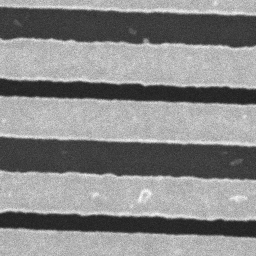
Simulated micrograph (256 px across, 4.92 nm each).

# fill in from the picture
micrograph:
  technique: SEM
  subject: lines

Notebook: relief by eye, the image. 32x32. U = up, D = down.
UUUUUUUUUUUUUUUUUUUUUUUUUUUUUUUU
DDDDDDDDDDDDDDDDDDUDUUUUUUUUUUUU
DDDDDDDDDDDDDDDDDDDDDDDDDDDDDDDD
DDDDDDDDDDDDDDDDDDDDDDDDDDDDDDDD
DDDDDDDDDDDDDDDDDDDDDDDDDDDDDDDD
UUUUUUUUUUUUUUUUUDUDUUUDDDDDDDDD
UUUUUUUUUUUUUUUUUUUUUUUUUUUUUUUU
UUUUUUUUUUUUUUUUUUUUUUUUUUUUUUUU
UUUUUUUUUUUUUUUUUUUUUUUUUUUUUUUU
UUUUUUUUUUUUUUUUUUUUUUUUUUUUUUUU
DDDDDDDDDDDDDDDDDUUUUUUUUUUUUUUU
DDDDDDDDDDDDDDDDDDDDDDDDDDDDDDDD
UUUUUUUUUUUUDDDDDDDDDDDDDDDDDDDD
UUUUUUUUUUUUUUUUUUUUUUUUUUUUUUUU
UUUUUUUUUUUUUUUUUUUUUUUUUUUUUUUU
UUUUUUUUUUUUUUUUUUUUUUUUUUUUUUUU
UUUUUUUUUUUUUUUUUUUUUUUUUUUUUUUU
DDDDDDDDDDDDUUUUUUUUUUUUUUUUUUUU
DDDDDDDDDDDDDDDDDDDDDDDDDDDDDDDD
DDDDDDDDDDDDDDDDDDDDDDDDDDDDDDDD
DDDDDDDDDDDDDDDDDDDDDDDDDDDDDDDD
UDDDDDDDDDDDDDDDDDDDDDDDDDDDDDDD
UUUUUUUUUUUUUUUUUUUUUUUUUUUUUUUD
UUUUUUUUUUUUUUUUUUUUUUUUUUUUUUUU
UUUUUUUUUUUUUUUUUUUUUUUUUUUUUUUU
UUUUUUUUUUUUUUUUUUUUUUUUUUUUUUUU
UDDUUUUUUUUUUUUUUUUUUUUUUUUUUUUU
DDDDDDDDDDDDDDDDDDDDDDDDDUUDUUUU
DDDDDDDDDDDDDDDDDDDDDDDDDDDDDDDD
UUUUUUUUUUUUUUUUUUUUUUUUUDDDDDDD
UUUUUUUUUUUUUUUUUUUUUUUUUUUUUUUU
UUUUUUUUUUUUUUUUUUUUUUUUUUUUUUUU